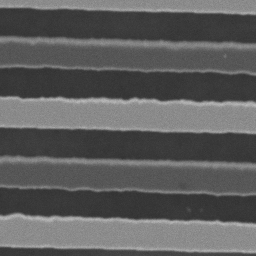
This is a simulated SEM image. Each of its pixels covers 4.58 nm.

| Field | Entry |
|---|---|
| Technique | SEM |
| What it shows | lines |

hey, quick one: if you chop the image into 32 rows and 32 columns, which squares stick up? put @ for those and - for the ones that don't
@@@@@@@@@@@@@@@@@@@@@@@@@@@@@@@@
------------------------@@@@@@@@
--------------------------------
--------------------------------
--------------------------------
@@@@@@@@@@@@@@@@@@@@@@@@@@@@@@@@
@@@@@@@@@@@@@@@@@@@@@@@@@@@@@@@@
@@@@@@@@@@@@@@@@@@@@@@@@@@@@@@@@
-------@@@@@@@@@@@@@@@@@@@@@@@@@
--------------------------------
--------------------------------
--------------------------------
@@@@@@@@@@@@@@@@@@@@------------
@@@@@@@@@@@@@@@@@@@@@@@@@@@@@@@@
@@@@@@@@@@@@@@@@@@@@@@@@@@@@@@@@
@@@@@@@@@@@@@@@@@@@@@@@@@@@@@@@@
------------------------@-@@@@@@
--------------------------------
--------------------------------
--------------------------------
@@@@@@@@@@@@@@@@@@@@@@@@@@@@@@@@
@@@@@@@@@@@@@@@@@@@@@@@@@@@@@@@@
@@@@@@@@@@@@@@@@@@@@@@@@@@@@@@@@
--@@@@@@@@@@@@@@@@@@@@@@@@@@@@@@
--------------------------------
--------------------------------
--------------------------------
@@@@@@@@@@@@@@@@@@@@@-----------
@@@@@@@@@@@@@@@@@@@@@@@@@@@@@@@@
@@@@@@@@@@@@@@@@@@@@@@@@@@@@@@@@
@@@@@@@@@@@@@@@@@@@@@@@@@@@@@@@@
------------------------------@@